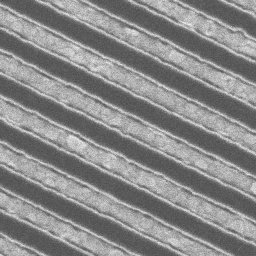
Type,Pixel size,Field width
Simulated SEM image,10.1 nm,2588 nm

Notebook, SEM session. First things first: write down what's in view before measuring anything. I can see parallel lines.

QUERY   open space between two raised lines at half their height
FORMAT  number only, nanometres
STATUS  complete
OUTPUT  195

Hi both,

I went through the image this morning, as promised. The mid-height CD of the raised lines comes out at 214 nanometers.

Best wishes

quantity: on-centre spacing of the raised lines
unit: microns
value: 0.414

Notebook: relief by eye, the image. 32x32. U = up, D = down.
UUUUUUDDDDDUUUUUUDDDDDDUUUUUUDDD
DDUUUUUUDDDDDUUUUUUDDDDDDUUUUUUD
DDDDUUUUUUDDDDDUUUUUUDDDDDDUUUUU
DDDDDDUUUUUUDDDDDUUUUUUUDDDDDUUU
UUDDDDDDUUUUUUDDDDDUUUUUUDDDDDDU
UUUUDDDDDDUUUUUUDDDDDUUUUUUDDDDD
UUUUUUDDDDDDUUUUUUDDDDDUUUUUUDDD
DDUUUUUUDDDDDDUUUUUUDDDDDUUUUUUD
DDDDDUUUUUDDDDDDUUUUUUDDDDDUUUUU
UDDDDDUUUUUUDDDDDDUUUUUUDDDDDDUU
UUUDDDDDUUUUUUDDDDDDUUUUUUDDDDDU
UUUUUDDDDDUUUUUUDDDDDDUUUUUUDDDD
DUUUUUUDDDDDUUUUUUDDDDDDUUUUUUDD
DDDUUUUUUDDDDDUUUUUUDDDDDDUUUUUU
DDDDDUUUUUUDDDDDDUUUUUDDDDDDUUUU
UDDDDDDUUUUUUDDDDDUUUUUUUDDDDDUU
UUUUDDDDDUUUUUUDDDDDUUUUUUUDDDDD
UUUUUUDDDDDUUUUUUDDDDDDUUUUUUDDD
DUUUUUUDDDDDDUUUUUUDDDDDUUUUUUUD
DDDUUUUUUUDDDDDUUUUUUDDDDDDUUUUU
DDDDDUUUUUUUDDDDDUUUUUUDDDDDDUUU
UUDDDDDDUUUUUUDDDDDUUUUUUDDDDDUU
UUUUDDDDDDUUUUUUDDDDDUUUUUUDDDDD
UUUUUUDDDDDDUUUUUUDDDDDUUUUUUDDD
DDUUUUUUDDDDDDUUUUUUDDDDDUUUUUUD
DDDDUUUUUUDDDDDUUUUUUDDDDDDUUUUU
UDDDDDUUUUUUDDDDDDUUUUUUDDDDDUUU
UUUDDDDDUUUUUUDDDDDDUUUUUUDDDDDU
UUUUUDDDDDUUUUUUDDDDDDUUUUUUDDDD
DUUUUUUDDDDDUUUUUUDDDDDDUUUUUUDD
DDUUUUUUUDDDDDUUUUUUDDDDDDUUUUUU
DDDDDUUUUUUDDDDDUUUUUUDDDDDDUUUU